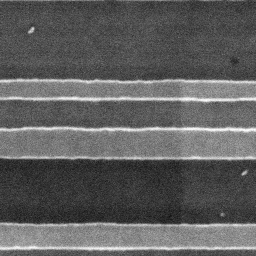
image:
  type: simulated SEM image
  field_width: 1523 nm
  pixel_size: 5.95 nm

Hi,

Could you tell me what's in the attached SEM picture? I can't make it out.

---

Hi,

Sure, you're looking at lines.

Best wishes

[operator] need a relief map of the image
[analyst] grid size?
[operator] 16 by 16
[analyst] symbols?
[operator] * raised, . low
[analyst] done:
................
................
................
................
................
****************
****************
****************
****************
****************
................
................
................
................
****************
****************